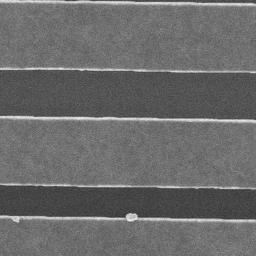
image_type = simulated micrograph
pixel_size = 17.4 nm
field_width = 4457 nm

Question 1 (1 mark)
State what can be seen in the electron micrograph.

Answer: lines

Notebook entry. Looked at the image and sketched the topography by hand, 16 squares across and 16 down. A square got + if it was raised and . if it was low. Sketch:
++++++++++++++++
++++++++++++++++
++++++++++++++++
++++++++++++++++
...............+
................
................
+++++++++++++...
++++++++++++++++
++++++++++++++++
++++++++++++++++
++++++++++++++++
................
........+.......
++++++++++++++++
++++++++++++++++